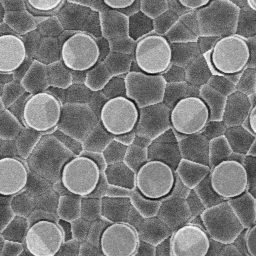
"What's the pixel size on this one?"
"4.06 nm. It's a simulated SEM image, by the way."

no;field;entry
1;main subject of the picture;a regular array of raised bodies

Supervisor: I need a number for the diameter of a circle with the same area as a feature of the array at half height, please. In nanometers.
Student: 146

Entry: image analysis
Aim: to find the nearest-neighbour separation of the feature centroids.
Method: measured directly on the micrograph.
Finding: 288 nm